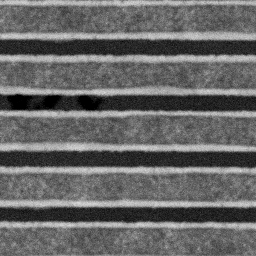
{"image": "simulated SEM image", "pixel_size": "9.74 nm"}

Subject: lines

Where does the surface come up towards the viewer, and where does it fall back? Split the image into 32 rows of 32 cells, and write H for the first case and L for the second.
HHHHHHHHHHHHHHHHHHHHHHHHHHHHHHHH
HHHHHHHHHHHHHHHHHHHHHHHHHHHHHHHH
HHHHHHHHHHHHHHHHHHHHHHHHHHHHHHHH
HHHHHHHHHHHHHHHHHHHHHHHHHHHHHHHH
HHHHHHHHHHHHHHHHHHHHHHHHHHHHHHHH
LLLLLLLLLLLLLLLLLLLLLLLLLLLLLLLL
LLLLLLLLLLLLLLLLLLLLLLLLLLLLLLLL
HHHHHHHHHHHHHHHHHHHHHHHHHHHHHHHH
HHHHHHHHHHHHHHHHHHHHHHHHHHHHHHHH
HHHHHHHHHHHHHHHHHHHHHHHHHHHHHHHH
HHHHHHHHHHHHHHHHHHHHHHHHHHHHHHHH
LLLHHHHHHHHHHHHHHHLLLHHHHHHHHHHH
LLLLLLLLLLLLLLLLLLLLLLLLLLLLLLLL
LLLLLLLLLLLLLLLLLLLLLLLLLLLLLLLL
HHHHHHHHHHHHHHHHHHHHHHHHHHHHHHHH
HHHHHHHHHHHHHHHHHHHHHHHHHHHHHHHH
HHHHHHHHHHHHHHHHHHHHHHHHHHHHHHHH
HHHHHHHHHHHHHHHHHHHHHHHHHHHHHHHH
HHHHHHHHHHHHHHHHHHHHHHHHHHHHHHHH
LLLLLLLLLLLLLLLLLLLLLLLLLLLLLLLL
LLLLLLLLLLLLLLLLLLLLLLLLLLLLLLLL
HHHHHHHHHHHHHHHHHHHHHHHHHHHHHHHH
HHHHHHHHHHHHHHHHHHHHHHHHHHHHHHHH
HHHHHHHHHHHHHHHHHHHHHHHHHHHHHHHH
HHHHHHHHHHHHHHHHHHHHHHHHHHHHHHHH
HHHHHHLLHHHHHHHHHHHHHHHHHHHHHHHH
LLLLLLLLLLLLLLLLLLLLLLLLLLLLLLLL
LLLLLLLLLLLLLLLLLLLLLLLLLLLLLLLL
HHHHHHHHHHHHHHHHHHHHHHHHHHHHHHHH
HHHHHHHHHHHHHHHHHHHHHHHHHHHHHHHH
HHHHHHHHHHHHHHHHHHHHHHHHHHHHHHHH
HHHHHHHHHHHHHHHHHHHHHHHHHHHHHHHH